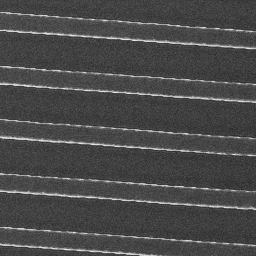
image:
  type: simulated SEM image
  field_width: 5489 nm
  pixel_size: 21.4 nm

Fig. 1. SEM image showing lines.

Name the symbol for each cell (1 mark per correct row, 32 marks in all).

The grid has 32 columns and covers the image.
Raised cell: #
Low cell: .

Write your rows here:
................................
................................
############....................
##########################......
..........######################
........................########
................................
................................
###.............................
################................
##############################..
..............##################
............................####
................................
................................
#######.........................
#####################...........
.....###########################
.................###############
................................
................................
................................
###########.....................
#########################.......
........########################
.......................#########
................................
................................
##..............................
##############..................
#############################...
.............###################